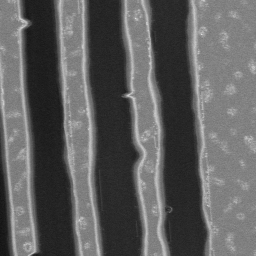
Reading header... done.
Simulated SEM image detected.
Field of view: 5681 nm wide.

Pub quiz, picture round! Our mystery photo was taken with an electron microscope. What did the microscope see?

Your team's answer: one or a few lines or trenches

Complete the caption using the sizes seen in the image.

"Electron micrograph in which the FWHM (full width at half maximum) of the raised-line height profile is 545 nm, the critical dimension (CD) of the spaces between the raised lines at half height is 40.4 px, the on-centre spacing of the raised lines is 65.8 px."